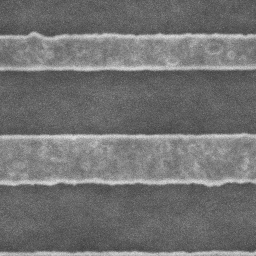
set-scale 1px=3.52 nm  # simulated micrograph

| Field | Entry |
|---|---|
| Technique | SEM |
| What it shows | one or a few lines or trenches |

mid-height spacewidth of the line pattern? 240 nm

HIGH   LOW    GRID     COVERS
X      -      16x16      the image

----------------
----------------
XXXXXXXXXXXXXXXX
XXXXXXXXXXXXXXXX
----------------
----------------
----------------
----------------
------XX--XXXXXX
XXXXXXXXXXXXXXXX
XXXXXXXXXXXXXXXX
-------------X--
----------------
----------------
----------------
----------------